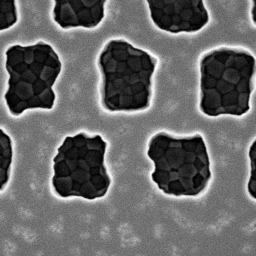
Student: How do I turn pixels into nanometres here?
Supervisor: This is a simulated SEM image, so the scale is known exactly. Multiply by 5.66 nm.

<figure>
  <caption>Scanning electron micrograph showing holes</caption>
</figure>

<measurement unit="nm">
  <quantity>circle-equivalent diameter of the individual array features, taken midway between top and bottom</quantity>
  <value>355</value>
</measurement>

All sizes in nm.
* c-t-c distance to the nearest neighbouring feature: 546